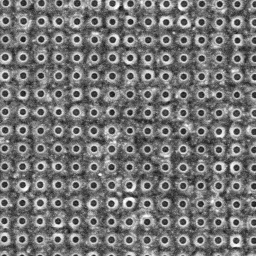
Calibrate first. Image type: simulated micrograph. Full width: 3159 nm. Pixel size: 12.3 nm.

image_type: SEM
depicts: a regular array of holes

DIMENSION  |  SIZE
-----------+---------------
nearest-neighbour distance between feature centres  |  216 nm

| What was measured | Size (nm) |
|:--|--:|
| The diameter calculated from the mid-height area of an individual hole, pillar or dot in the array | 86.9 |